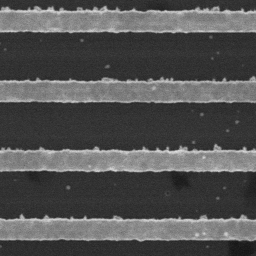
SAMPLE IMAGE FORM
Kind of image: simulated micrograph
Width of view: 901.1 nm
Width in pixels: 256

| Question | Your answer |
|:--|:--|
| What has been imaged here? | lines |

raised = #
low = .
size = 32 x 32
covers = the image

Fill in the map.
................................
################################
################################
################################
................................
................................
................................
................................
................................
................................
################################
################################
################################
................................
................................
................................
................................
................................
................................
################################
################################
................................
................................
................................
................................
................................
................................
######################.#.######.
################################
################################
................................
................................